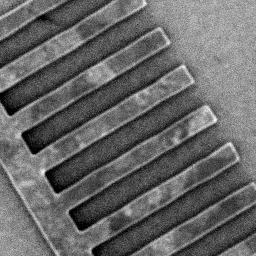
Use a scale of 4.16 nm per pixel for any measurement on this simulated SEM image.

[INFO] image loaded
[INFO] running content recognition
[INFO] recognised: groups of lines, slits or small figures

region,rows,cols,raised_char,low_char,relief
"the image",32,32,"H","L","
LLLHHHHHLLLLLLHHHHLLLLLLLLLLLLLL
LHHHHHLLLLLLHHHHHLLLLLLLLLLLLLLL
HHHHLLLLLLLHHHHLLLLLLLLLLLLLLLLL
HHHLLLLLLHHHHLLLLLLLLLLLLLLLLLLL
HLLLLLLHHHHHLLLLLLHHHLLLLLLLLLLL
LLLLLLHHHHLLLLLLLHHHHLLLLLLLLLLL
LLLLHHHHHLLLLLLHHHHHLLLLLLLLLLLL
LLHHHHHLLLLLLHHHHHLLLLLLLLLLLLLL
HHHHHLLLLLLLHHHHLLLLLLHLLLLLLLLL
HHHLLLLLLLHHHHHLLLLLLHHHLLLLLLLL
HHLLLLLLHHHHHLLLLLLHHHHHLLLLLLLL
LLLLLLLHHHHLLLLLLLHHHHLLLLLLLLLL
LLLLLHHHHLLLLLLLHHHHLLLLLLLLLLLL
LLLHHHHHLLLLLLHHHHHLLLLLLHLLLLLL
HHHHHHLLLLLLHHHHHLLLLLLLHHHLLLLL
HHHHHLLLLLLHHHHHLLLLLLHHHHHLLLLL
HHHLLLLLLHHHHHLLLLLLHHHHHLLLLLLL
HHHLLLLHHHHHLLLLLLLHHHHLLLLLLLLL
HHHHLLHHHHHLLLLLLHHHHLLLLLLLHLLL
HHHHHHHHHLLLLLLHHHHHLLLLLLHHHHLL
HHHHHHHLLLLLLLHHHHLLLLLLHHHHHLLL
LHHHHHLLLLLLHHHHLLLLLLLHHHHHLLLL
LHHHHHLLLLHHHHHLLLLLLHHHHHLLLLLL
LLHHHHLLLHHHHLLLLLLLHHHHLLLLLLLH
LLLHHHHHHHHHLLLLLLHHHHLLLLLLLHHH
LLLHHHHHHHLLLLLLHHHHHLLLLLLHHHHH
LLLLHHHHHLLLLLLHHHHLLLLLLLHHHHLL
LLLLHHHHHLLLLHHHHHLLLLLLHHHHHLLL
LLLLLHHHHHLHHHHHLLLLLLHHHHHLLLLL
LLLLLLHHHHHHHHLLLLLLHHHHHLLLLLLL
LLLLLLHHHHHHLLLLLLLHHHHHLLLLLLHH
LLLLLLLHHHHLLLLLLHHHHHLLLLLLHHHH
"